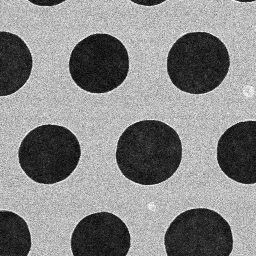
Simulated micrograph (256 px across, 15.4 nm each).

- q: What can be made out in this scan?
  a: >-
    holes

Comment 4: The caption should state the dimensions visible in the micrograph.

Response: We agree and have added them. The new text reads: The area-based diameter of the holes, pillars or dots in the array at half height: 955 nm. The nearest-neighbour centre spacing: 1530 nm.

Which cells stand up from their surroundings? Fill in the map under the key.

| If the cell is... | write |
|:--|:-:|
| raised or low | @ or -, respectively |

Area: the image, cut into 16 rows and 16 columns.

@@@@@@@@@@@@@@@@
@@@@@@@@@@@@@@@@
-@@@@--@@@@---@@
--@@----@@@---@@
--@@----@@----@@
-@@@@--@@@@--@@@
@@@@@@@@@@@@@@@@
@@@@@@@@@@@@@@@@
@@---@@@---@@@--
@----@@----@@@--
@----@@----@@@--
@@@@@@@@@-@@@@@@
@@@@@@@@@@@@@@@@
-@@@@--@@@@---@@
--@@@---@@----@@
--@@----@@-----@